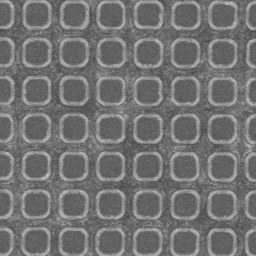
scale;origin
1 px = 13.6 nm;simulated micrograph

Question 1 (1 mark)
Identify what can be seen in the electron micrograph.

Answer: a regular array of raised bodies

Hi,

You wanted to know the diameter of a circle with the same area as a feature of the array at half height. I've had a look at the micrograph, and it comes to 0.394 micrometres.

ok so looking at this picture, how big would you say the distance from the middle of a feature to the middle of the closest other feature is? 505 nanometres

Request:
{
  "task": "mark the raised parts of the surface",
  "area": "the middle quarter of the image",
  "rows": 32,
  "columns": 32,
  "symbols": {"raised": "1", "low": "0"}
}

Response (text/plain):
00000000000000000000000000001111
00000000000000000000000000000000
00000000000000000000000000000000
11111000001000000000000000000000
11111100011111100011111100011111
11111100011111100011111100011111
11111100011111100011111100011111
11111100011111100011111100011111
11111100011111100011111100011111
11111000011111000011111100001111
00000000000000000000000000000000
00000000000000000000000000000000
00000000000000000000000000000000
11111000011111000011111100001111
11111100011111100011111100011111
11111100011111100011111100011111
11111100011111100011111100011111
11111100011111100011111100011111
11111000011111100011111100011111
00000000000000000001111000000111
00000000000000000000000000000000
00000000000000000000000000000000
11111000001111000001111000001111
11111100011111100011111100011111
11111100011111100011111100011111
11111100011111100011111100011111
11111100011111100011111100011111
11111000011111100011111100011111
11111000011111000011111000001111
00000000000000000000000000000000
00000000000000000000000000000000
00000000000000000000000000000000